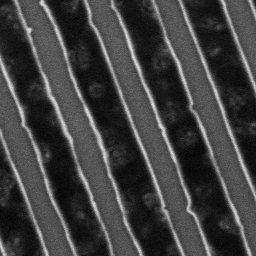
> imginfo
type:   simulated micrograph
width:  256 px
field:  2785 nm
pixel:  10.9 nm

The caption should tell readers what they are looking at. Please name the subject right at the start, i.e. one or a few lines or trenches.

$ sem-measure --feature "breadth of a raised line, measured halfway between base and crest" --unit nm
420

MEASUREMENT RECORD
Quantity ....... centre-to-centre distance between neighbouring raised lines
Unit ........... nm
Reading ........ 692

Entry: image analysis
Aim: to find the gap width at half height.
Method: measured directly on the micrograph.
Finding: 273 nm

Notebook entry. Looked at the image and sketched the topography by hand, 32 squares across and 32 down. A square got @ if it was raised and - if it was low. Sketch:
@@---@@@@@@---@@@@@----@@@@@---@
@@@---@@@@@----@@@@@---@@@@@----
@@@---@@@@@----@@@@@---@@@@@@---
@@@@---@@@@@---@@@@@----@@@@@---
@@@@---@@@@@----@@@@@---@@@@@---
@@@@----@@@@@---@@@@@----@@@@@--
@@@@----@@@@@---@@@@@@---@@@@@--
@@@@@---@@@@@----@@@@@---@@@@@@-
@@@@@----@@@@@---@@@@@@---@@@@@-
-@@@@@---@@@@@----@@@@@---@@@@@-
-@@@@@---@@@@@@---@@@@@----@@@@@
--@@@@----@@@@@----@@@@@---@@@@@
--@@@@@---@@@@@----@@@@@---@@@@@
--@@@@@----@@@@@---@@@@@----@@@@
---@@@@----@@@@@----@@@@@---@@@@
---@@@@@----@@@@@---@@@@@---@@@@
----@@@@----@@@@@---@@@@@----@@@
----@@@@@---@@@@@----@@@@@---@@@
@---@@@@@----@@@@@---@@@@@----@@
@----@@@@----@@@@@----@@@@@---@@
@@---@@@@@---@@@@@@---@@@@@---@@
@@---@@@@@----@@@@@---@@@@@----@
@@----@@@@----@@@@@----@@@@@---@
@@@---@@@@@---@@@@@@---@@@@@---@
@@@---@@@@@----@@@@@---@@@@@----
@@@@---@@@@@---@@@@@----@@@@@---
@@@@---@@@@@---@@@@@@---@@@@@---
@@@@----@@@@@---@@@@@----@@@@@--
@@@@@---@@@@@---@@@@@@---@@@@@--
@@@@@---@@@@@---@@@@@@---@@@@@--
@@@@@----@@@@@---@@@@@----@@@@@-
@@@@@@---@@@@@---@@@@@@---@@@@@-